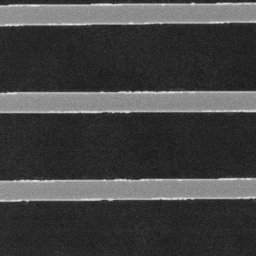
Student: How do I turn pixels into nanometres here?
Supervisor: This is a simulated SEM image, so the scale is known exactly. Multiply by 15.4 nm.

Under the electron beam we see lines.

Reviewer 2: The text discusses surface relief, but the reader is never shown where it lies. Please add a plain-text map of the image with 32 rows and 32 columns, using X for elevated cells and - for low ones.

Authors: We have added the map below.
------------------------X--XXXXX
XXXXXXXXXXXXXXXXXXXXXXXXXXXXXXXX
XXXXXXXXXXXXXXXXXXXXXXXXXXXXXXXX
--------------------------------
--------------------------------
--------------------------------
--------------------------------
--------------------------------
--------------------------------
--------------------------------
--------------------------------
--------------------------------
XXXXXXXXXXXXXXXXXXXXXXXXXXXXXXXX
XXXXXXXXXXXXXXXXXXXXXXXXXXXXXXXX
--------------------------------
--------------------------------
--------------------------------
--------------------------------
--------------------------------
--------------------------------
--------------------------------
--------------------------------
-------------XXX-XXXXXXXXXXXXXXX
XXXXXXXXXXXXXXXXXXXXXXXXXXXXXXXX
XXXXXXXXXXXXXXXXXXXXXXXXXXXXXXXX
--------------------------------
--------------------------------
--------------------------------
--------------------------------
--------------------------------
--------------------------------
--------------------------------